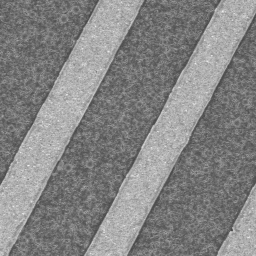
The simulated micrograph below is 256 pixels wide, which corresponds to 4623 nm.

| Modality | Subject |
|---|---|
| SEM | one or a few lines or trenches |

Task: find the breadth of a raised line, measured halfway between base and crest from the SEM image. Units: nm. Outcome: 659